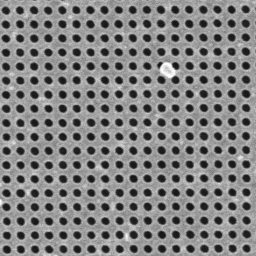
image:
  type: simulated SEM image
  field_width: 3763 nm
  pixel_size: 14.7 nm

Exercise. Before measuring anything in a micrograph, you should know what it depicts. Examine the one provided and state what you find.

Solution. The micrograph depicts a regular array of holes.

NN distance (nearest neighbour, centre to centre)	204	nm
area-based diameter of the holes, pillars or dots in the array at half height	0.129	um